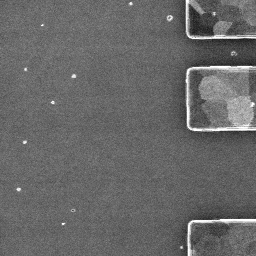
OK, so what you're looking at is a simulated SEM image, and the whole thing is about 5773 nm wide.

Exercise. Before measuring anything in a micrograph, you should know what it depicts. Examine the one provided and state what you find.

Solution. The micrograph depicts wiring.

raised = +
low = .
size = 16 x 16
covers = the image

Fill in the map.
............++++
............++++
................
................
............++++
............++++
............++++
............++++
................
................
................
................
................
................
............++++
............++++